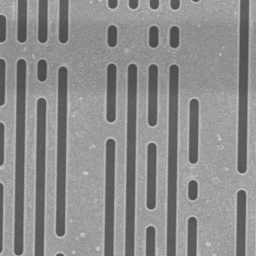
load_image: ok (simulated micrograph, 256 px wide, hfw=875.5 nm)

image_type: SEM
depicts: groups of lines, slits or small figures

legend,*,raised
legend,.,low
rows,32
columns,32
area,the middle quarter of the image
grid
***********..***..***..****.****
.**********..***..***...**...***
.**********..***..***...**...***
.**********..***..***...**...***
.**********..***..***...**...***
.**********..***..***...**...***
.**********..***..***...**...***
.**********..***..***...**...***
.**********..***..***...**...***
.*********...***..***...**...**.
.*********...***..***...**...**.
.*********...***..***...**...**.
.*********...***..***...**...**.
.**********..**...***...**...**.
.**********.***...***..***...**.
.**************...********...**.
.**************...********...**.
.**************...********...**.
.**************...********...**.
.**********..**...********..***.
.*********...**...***..***..***.
.*********...**...***..***..***.
.*********...**...***..***..***.
.*********...**...***..***..***.
.*********...**...***..***..***.
.*********...**...***..***..****
.*********...**...***..***..****
.*********...**...***..***..****
.*********...**...***..***..****
.*********...**...***..***..***.
.*********...**...***..***..***.
.*********...**...***..***..***.